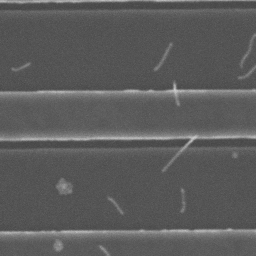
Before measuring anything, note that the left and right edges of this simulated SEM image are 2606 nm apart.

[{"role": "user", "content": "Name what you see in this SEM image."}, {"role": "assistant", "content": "lines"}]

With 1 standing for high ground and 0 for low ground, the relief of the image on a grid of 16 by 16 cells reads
0000000000000000
0000000000000000
0000000000000000
0000000000000000
0000000000000000
0000000000000000
1111111111111111
1111111111111111
1111111111111111
0000000000000000
0000000000000000
0000000000000000
0000000000000000
0000000000000000
0001111111111111
1111111111111111